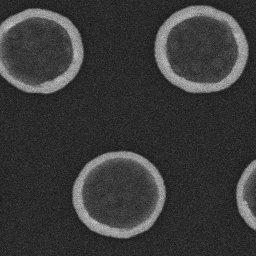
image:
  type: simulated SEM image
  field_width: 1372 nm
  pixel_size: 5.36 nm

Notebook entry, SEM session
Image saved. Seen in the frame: raised bodies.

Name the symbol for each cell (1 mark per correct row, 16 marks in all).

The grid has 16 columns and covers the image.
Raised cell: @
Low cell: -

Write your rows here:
----------------
@@@@------@@@@@-
@@@@@-----@@@@@-
@@@@@-----@@@@@-
@@@@@-----@@@@@-
--@---------@@--
----------------
----------------
----------------
----------------
------@@@-------
-----@@@@@-----@
-----@@@@@-----@
-----@@@@@-----@
-------@--------
----------------